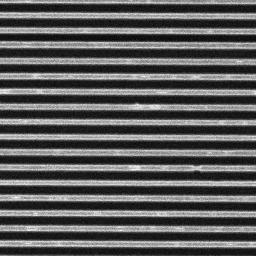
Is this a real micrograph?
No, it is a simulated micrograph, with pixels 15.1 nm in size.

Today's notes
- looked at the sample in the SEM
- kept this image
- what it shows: parallel lines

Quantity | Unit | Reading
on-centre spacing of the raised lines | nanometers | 230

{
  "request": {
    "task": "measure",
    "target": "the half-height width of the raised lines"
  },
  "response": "109 nm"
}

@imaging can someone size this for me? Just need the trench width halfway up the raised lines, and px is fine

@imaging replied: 8.25